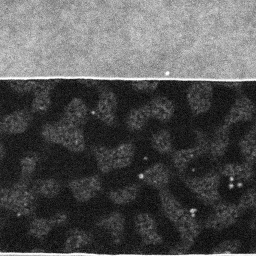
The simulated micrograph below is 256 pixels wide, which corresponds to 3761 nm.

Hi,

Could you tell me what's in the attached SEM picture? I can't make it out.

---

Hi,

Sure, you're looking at one or a few lines or trenches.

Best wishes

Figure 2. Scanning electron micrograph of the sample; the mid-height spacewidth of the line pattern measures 2.57 microns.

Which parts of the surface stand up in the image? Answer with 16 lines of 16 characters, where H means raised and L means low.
HHHHHHHHHHHHHHHH
HHHHHHHHHHHHHHHH
HHHHHHHHHHHHHHHH
HHHHHHHHHHHHHHHH
HHHHHHHHHHHHHHHH
LLLLLLLLLLLLLLLL
LLLLLLLLLLLLLLLL
LLLLLLLLLLLLLLLL
LLLLLLLLLLLLLLLL
LLLLLLLLLLLLLLLL
LLLLLLLLLLLLLLLL
LLLLLLLLLLLLLLLL
LLLLLLLLLLLLLLLL
LLLLLLLLLLLLLLLL
LLLLLLLLLLLLLLLL
LLLLLLLLLLLLLLLL